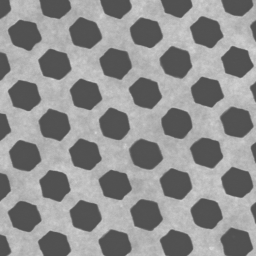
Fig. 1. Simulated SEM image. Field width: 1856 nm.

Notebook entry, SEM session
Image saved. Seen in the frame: a regular array of holes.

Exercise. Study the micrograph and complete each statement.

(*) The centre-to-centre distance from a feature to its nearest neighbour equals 306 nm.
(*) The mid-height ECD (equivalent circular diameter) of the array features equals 219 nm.